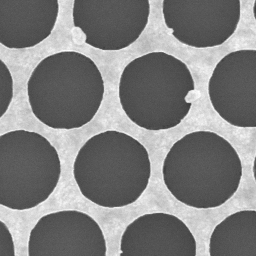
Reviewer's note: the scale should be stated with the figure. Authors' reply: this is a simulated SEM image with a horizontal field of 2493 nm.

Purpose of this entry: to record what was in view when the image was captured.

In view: holes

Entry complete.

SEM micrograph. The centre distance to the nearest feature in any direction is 873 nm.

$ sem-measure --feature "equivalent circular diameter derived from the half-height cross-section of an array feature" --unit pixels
76.9